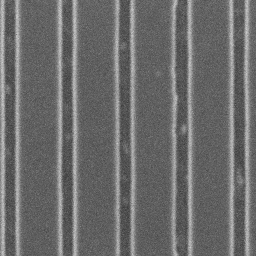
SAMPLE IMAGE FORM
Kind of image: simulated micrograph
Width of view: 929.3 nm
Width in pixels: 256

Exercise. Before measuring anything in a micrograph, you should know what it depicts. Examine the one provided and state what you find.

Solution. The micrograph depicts parallel lines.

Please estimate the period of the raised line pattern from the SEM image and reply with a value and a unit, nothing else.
208 nm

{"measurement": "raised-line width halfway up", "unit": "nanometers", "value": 159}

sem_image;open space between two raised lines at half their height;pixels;13.6